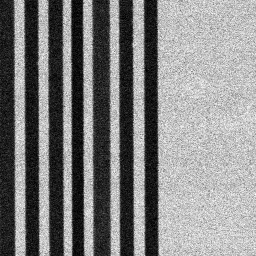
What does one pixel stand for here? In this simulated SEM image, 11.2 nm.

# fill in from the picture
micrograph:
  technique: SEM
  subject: parallel lines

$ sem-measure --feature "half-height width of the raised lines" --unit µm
0.126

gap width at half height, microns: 0.136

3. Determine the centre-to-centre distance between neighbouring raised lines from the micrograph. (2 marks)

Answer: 267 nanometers